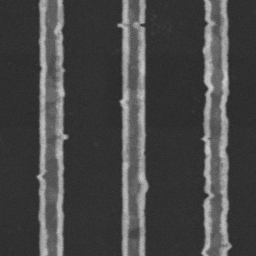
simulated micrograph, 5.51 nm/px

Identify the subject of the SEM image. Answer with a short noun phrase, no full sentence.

one or a few lines or trenches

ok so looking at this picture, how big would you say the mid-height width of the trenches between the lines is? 357 nm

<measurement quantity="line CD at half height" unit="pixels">17.4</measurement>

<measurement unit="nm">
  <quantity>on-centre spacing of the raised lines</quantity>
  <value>453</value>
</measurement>